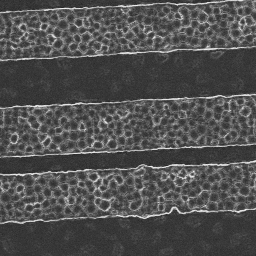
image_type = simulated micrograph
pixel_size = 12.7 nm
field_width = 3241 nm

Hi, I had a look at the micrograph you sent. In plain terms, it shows one or a few lines or trenches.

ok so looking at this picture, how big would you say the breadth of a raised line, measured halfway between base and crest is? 0.61 um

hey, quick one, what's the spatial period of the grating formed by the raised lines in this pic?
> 1.01 microns